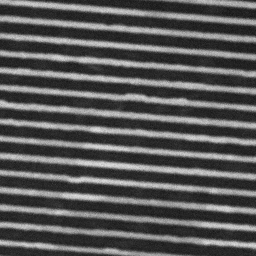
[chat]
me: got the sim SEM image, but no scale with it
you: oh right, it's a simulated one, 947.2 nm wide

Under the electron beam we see parallel lines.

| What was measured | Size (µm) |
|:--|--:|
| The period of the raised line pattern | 0.0633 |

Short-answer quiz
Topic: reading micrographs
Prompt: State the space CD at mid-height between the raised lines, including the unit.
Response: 0.0479 microns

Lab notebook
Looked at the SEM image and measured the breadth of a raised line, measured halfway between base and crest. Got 14.7 nanometres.